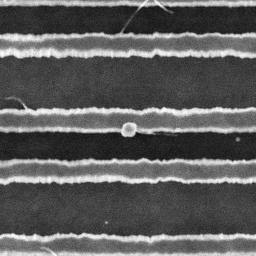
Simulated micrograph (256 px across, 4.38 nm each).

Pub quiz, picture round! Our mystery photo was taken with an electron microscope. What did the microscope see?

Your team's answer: lines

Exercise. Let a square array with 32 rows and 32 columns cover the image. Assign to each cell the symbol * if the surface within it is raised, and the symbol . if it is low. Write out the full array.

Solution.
********************************
................................
................................
................................
****.***************************
********************************
********************************
................................
................................
................................
................................
................................
................................
...............................*
********************************
********************************
..........****.****..*.....**...
................................
................................
................................
********************************
********************************
********************************
................................
................................
................................
................................
................................
................................
***.*.*********..*.**.**********
********************************
********************************